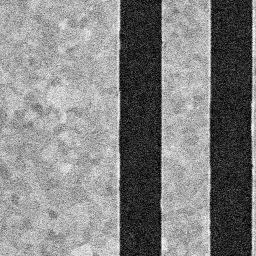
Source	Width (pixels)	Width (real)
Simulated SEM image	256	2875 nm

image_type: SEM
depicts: one or a few lines or trenches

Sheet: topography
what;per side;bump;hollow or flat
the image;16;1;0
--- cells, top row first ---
1111111000111000
1111111000111000
1111111000111000
1111111000111000
1111111000111000
1111111000111000
1111111000111000
1111111000111000
1111111000111000
1111111000111000
1111111000111000
1111111000111000
1111111000111000
1111111000111000
1111111000111000
1111111000111000